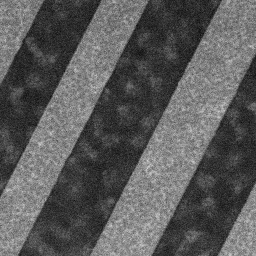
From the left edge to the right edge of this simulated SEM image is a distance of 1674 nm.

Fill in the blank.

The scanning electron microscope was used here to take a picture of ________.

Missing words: one or a few lines or trenches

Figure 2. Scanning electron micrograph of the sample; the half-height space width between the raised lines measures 423 nm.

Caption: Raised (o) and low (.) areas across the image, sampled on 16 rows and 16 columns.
oo....ooo.....oo
oo....ooo....ooo
o....ooo.....ooo
o....oo.....oooo
....ooo.....ooo.
....oo.....oooo.
...ooo.....ooo..
...oo.....oooo..
..ooo.....ooo...
..oo.....oooo...
.ooo....oooo....
.oo.....oooo....
ooo....oooo....o
oo.....oooo....o
oo....oooo....oo
o.....oooo....oo